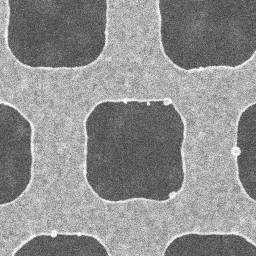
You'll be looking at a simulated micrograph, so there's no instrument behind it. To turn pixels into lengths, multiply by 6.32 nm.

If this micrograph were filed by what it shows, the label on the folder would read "holes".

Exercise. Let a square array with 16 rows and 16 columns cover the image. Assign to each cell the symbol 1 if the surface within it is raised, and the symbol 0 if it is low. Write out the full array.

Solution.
1000000111000000
0000000111000000
0000000111000000
1000001111000000
1111111111111111
1111111111111111
1111110000011111
0011100000011110
0011100000001110
0011100000011110
0011100000011110
0011110000011110
0111111011111111
1111111111111111
1111111111111111
1000000111000000